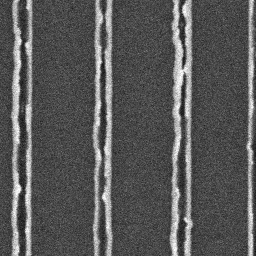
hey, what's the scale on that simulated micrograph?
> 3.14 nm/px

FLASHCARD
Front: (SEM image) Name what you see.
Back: one or a few lines or trenches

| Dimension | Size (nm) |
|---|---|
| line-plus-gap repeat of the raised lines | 251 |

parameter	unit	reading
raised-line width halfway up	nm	45.9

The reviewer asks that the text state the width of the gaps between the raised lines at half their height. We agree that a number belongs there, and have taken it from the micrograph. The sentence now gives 0.202 µm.